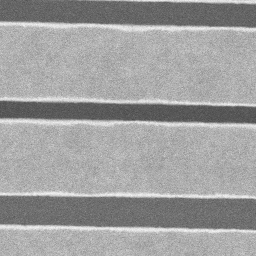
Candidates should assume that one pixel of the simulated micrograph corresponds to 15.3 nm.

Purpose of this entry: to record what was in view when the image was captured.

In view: lines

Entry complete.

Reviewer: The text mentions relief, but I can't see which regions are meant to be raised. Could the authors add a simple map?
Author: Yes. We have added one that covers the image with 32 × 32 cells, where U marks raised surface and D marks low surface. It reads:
DDDDDDDDDDDDDDDDDDDDDDDDDDDDDDDD
DDDDDDDDDDDDDDDDDDDDDDDDDDDDDDDD
DDDDDDDDDDDDDDDDDDDDDDDDDDDDDDDD
UUUUUUUUUUUUUUUUUUUUUUUUUUUUUUUD
UUUUUUUUUUUUUUUUUUUUUUUUUUUUUUUU
UUUUUUUUUUUUUUUUUUUUUUUUUUUUUUUU
UUUUUUUUUUUUUUUUUUUUUUUUUUUUUUUU
UUUUUUUUUUUUUUUUUUUUUUUUUUUUUUUU
UUUUUUUUUUUUUUUUUUUUUUUUUUUUUUUU
UUUUUUUUUUUUUUUUUUUUUUUUUUUUUUUU
UUUUUUUUUUUUUUUUUUUUUUUUUUUUUUUU
UUUUUUUUUUUUUUUUUUUUUUUUUUUUUUUU
UUUUUUUUUUUUUUUUUUUUUUUUUUUUUUUU
DDDDDDDDDDDDDDDDDDDDDDDDDDDDDDDD
DDDDDDDDDDDDDDDDDDDDDDDDDDDDDDDD
UUUUUUUUUUUUUUUUUUUUUUUUUUUUUUUU
UUUUUUUUUUUUUUUUUUUUUUUUUUUUUUUU
UUUUUUUUUUUUUUUUUUUUUUUUUUUUUUUU
UUUUUUUUUUUUUUUUUUUUUUUUUUUUUUUU
UUUUUUUUUUUUUUUUUUUUUUUUUUUUUUUU
UUUUUUUUUUUUUUUUUUUUUUUUUUUUUUUU
UUUUUUUUUUUUUUUUUUUUUUUUUUUUUUUU
UUUUUUUUUUUUUUUUUUUUUUUUUUUUUUUU
UUUUUUUUUUUUUUUUUUUUUUUUUUUUUUUU
DDDDDDDUUUUUUUUUUUUUUUUUUUUUUUUU
DDDDDDDDDDDDDDDDDDDDDDDDDDDDDDDD
DDDDDDDDDDDDDDDDDDDDDDDDDDDDDDDD
DDDDDDDDDDDDDDDDDDDDDDDDDDDDDDDD
UUUUUUUUUUUUUUUUUDDDDDDDDDDDDDDD
UUUUUUUUUUUUUUUUUUUUUUUUUUUUUUUU
UUUUUUUUUUUUUUUUUUUUUUUUUUUUUUUU
UUUUUUUUUUUUUUUUUUUUUUUUUUUUUUUU